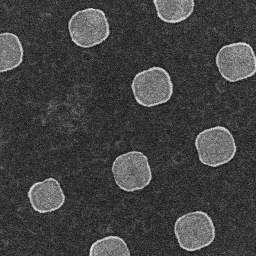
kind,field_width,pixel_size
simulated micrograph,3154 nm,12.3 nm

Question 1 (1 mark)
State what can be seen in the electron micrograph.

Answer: raised bodies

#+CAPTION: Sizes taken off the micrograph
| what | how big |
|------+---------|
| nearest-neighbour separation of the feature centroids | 1070 nanometres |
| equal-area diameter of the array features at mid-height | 0.472 um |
